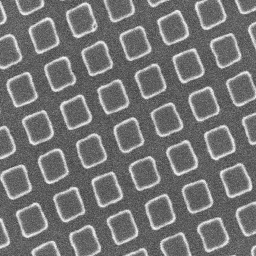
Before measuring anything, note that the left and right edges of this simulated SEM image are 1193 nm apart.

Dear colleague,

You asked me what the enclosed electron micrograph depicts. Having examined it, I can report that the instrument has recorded a regular array of raised bodies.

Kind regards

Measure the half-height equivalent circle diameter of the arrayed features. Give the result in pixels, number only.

30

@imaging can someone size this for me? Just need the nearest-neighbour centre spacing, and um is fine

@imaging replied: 0.189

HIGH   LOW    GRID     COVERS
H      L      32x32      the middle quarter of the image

HLLLLLHHHHHHLLLLLLLLLLHLLLLLHHHH
HHLLLLHHHHHLLLLLLLLHHHHHLLLLHHHH
HHLLLLLHLLLLLLLLLLHHHHHHLLLLLHHH
HHHLLLLLLLLLLLLLLLHHHHHHHLLLLHHH
HHHLLLLLLLLLHHLLLLHHHHHHHLLLLLHL
HLLLLLLLLLHHHHHLLLLHHHHHHLLLLLLL
LLLLLLLLLHHHHHHLLLLHHHHHHLLLLLLL
LLLLLLLLLHHHHHHLLLLLHHHLLLLLLLLL
LLHHHLLLLHHHHHHHLLLLHLLLLLLLLLLH
HHHHHLLLLHHHHHHHLLLLLLLLLLLLLLLH
HHHHHHLLLLHHHHHHLLLLLLLLLHHHLLLL
HHHHHHLLLLHHHHLLLLLLLLLHHHHHLLLL
HHHHHHHLLLLLLLLLLLLLLLHHHHHHLLLL
HHHHHHHLLLLLLLLLLLLLLLHHHHHHHLLL
HHHHHHLLLLLLLLLHHHLLLLHHHHHHHLLL
LHHHLLLLLLLLLHHHHHHLLLLHHHHHHHLL
LLLLLLLLLLLLLHHHHHHLLLLHHHHHHLLL
LLLLLLLLLLLLLHHHHHHLLLLLHHLLLLLL
LLLLLHHHHLLLLHHHHHHHLLLLLLLLLLLL
LLLLHHHHHLLLLHHHHHHHLLLLLLLLLLHL
LLLHHHHHHHLLLLHHHHHLLLLLLLLHHHHH
LLLHHHHHHHLLLLHHHLLLLLLLLLHHHHHH
LLLLHHHHHHHLLLLLLLLLLLLLLLHHHHHH
LLLLHHHHHHLLLLLLLLLLHHLLLLHHHHHH
LLLLLHHHHLLLLLLLLLHHHHHLLLLHHHHH
HLLLLHHLLLLLLLLLLHHHHHHLLLLHHHHH
HLLLLLLLLLLLLLLLHHHHHHHLLLLLHHHL
HLLLLLLLLLLHLLLLLHHHHHHHLLLLHLLL
LLLLLLLLHHHHHLLLLHHHHHHHLLLLLLLL
LLLLLLLHHHHHHLLLLHHHHHHHLLLLLLLL
LLLLLLLHHHHHHHLLLLHHHHLLLLLLLLHH
LHHLLLLHHHHHHHLLLLLLLLLLLLLLLLHH